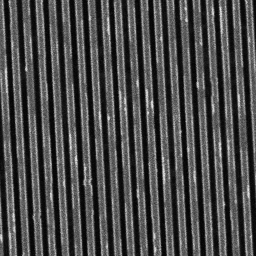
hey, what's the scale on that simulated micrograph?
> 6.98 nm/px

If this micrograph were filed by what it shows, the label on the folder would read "parallel lines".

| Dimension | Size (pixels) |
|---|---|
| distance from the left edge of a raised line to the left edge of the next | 13.1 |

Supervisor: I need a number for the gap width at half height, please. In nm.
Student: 34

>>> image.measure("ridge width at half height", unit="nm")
54